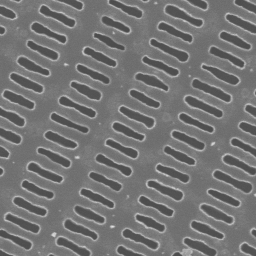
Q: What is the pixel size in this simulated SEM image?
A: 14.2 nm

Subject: a regular array of holes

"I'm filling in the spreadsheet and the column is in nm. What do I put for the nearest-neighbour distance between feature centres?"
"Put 258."